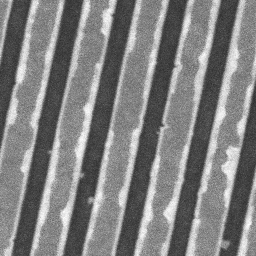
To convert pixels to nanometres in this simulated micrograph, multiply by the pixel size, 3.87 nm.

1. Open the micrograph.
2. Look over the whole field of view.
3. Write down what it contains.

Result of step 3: parallel lines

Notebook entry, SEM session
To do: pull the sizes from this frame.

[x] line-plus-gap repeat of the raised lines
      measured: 0.197 micrometres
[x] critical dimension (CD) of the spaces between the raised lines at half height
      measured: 82.8 nanometers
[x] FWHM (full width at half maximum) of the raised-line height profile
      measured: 114 nm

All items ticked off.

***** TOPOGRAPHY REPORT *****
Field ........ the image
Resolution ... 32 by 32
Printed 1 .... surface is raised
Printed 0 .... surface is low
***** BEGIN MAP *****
10001111000111000111100011100011
10001111001111000111100111100011
10001110001111000111000111100011
10011110001111001111000111100111
00011110001110001111000111000111
00011110001110001111000111000111
00011100011110001111001111000111
00011100011110001110001111000111
00111100011110011110001111001111
00111100011100011110001110001111
00111100111100011110011110001111
00111000111100011100011110001110
00111000111100011100011110001110
01111000111000111100011100011110
01111000111000111100011100011110
01110001111000111100011100011110
01110001111000111000111100011100
01110001111001111000111100011100
11110001110001111000111000111100
11110001110001111000111000111100
11110011110001111001111000111100
11100011110001110001111000111000
11100011110001110001111001111000
11100011100011110001110001111000
11100011100011110001110001111000
11000111100011100011110001111001
11000111100011100011110001110001
11000111100111100011110011110001
11000111000111100011100011110001
11001111000111100011100011110011
10001111000111000111100011100011
10001111000111000111100011100011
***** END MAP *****